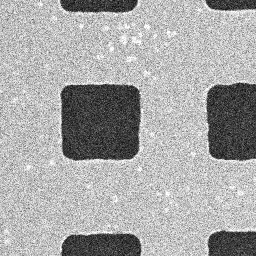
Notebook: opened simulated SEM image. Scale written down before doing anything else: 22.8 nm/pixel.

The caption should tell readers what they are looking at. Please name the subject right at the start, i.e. holes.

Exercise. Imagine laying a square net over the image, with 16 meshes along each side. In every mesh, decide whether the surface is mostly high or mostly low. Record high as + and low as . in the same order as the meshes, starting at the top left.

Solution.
++++....+++++...
++++++++++++++++
++++++++++++++++
++++++++++++++++
++++++++++++++++
++++....+++++...
++++.....++++...
++++.....++++...
++++.....++++...
++++.....++++...
++++++++++++++++
++++++++++++++++
++++++++++++++++
++++++++++++++++
++++++++++++++..
++++.....++++...